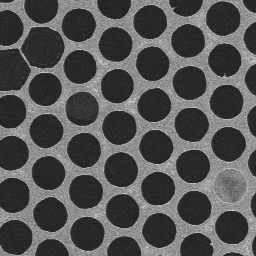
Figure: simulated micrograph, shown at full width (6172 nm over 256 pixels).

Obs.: a regular array of holes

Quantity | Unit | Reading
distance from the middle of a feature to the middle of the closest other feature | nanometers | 1000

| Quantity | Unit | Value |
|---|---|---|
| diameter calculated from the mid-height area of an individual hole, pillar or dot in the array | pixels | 34.1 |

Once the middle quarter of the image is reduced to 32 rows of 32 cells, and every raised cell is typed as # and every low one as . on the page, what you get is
........##########........#####.
........####...###........##....
........##......###.......##....
#......###.......###....###.....
##....###........##########.....
#########........##########.....
#########........####...####....
##.....##........###......##....
#.......##......###.......###...
#.......####...###.........#####
.........#########.........#####
.........#########.........##...
.........##......##.......##....
#.......##........##.....###....
##.....###........###..#####....
####.####.........##########....
##########........####..####....
###....###........##.....###....
##......##.......##........##...
#........##.....###........#####
#........##########........#####
#........##########........####.
#........###....###........##...
#........##......###......##....
##......##........###....###....
####...###........##########....
##########.........#########....
##########........###.....##....
###.....##........##.......##...
##.......##......##........####.
#.........###...###.........####
#.........#########.........####